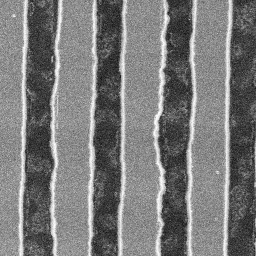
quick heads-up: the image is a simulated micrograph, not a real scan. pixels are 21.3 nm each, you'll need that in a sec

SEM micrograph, one or a few lines or trenches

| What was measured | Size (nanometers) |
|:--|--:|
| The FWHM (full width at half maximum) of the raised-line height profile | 823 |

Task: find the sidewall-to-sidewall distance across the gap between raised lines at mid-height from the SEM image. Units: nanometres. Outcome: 623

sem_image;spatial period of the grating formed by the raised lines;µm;1.45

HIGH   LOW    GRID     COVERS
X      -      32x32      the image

XXX----XXXXX----XXXXX---XXXXX---
XXX----XXXXX---XXXXXX---XXXXX---
XXX----XXXXX---XXXXXX---XXXXX---
XXX----XXXXX----XXXXX---XXXXX---
XXX----XXXXX----XXXX----XXXXX---
XXX----XXXXX----XXXXX---XXXXX---
XXX----XXXXX---XXXXXX---XXXXX---
XXX----XXXXX---XXXXXX---XXXXX---
XXX----XXXXX---XXXXX----XXXXX---
XXX----XXXXX---XXXXX----XXXXX---
XXX----XXXXX---XXXXX----XXXX----
XXX----XXXXX---XXXXX----XXXX----
XXX----XXXXX---XXXXX----XXXX----
XXX----XXXXX---XXXXX----XXXX----
XXX----XXXXX---XXXXX----XXXX----
XXX---XXXXXX---XXXXX----XXXX----
XXX---XXXXXX---XXXXX----XXXX----
XXX----XXXX----XXXXX----XXXX----
XXX----XXXX----XXXXX----XXXX----
XXX----XXXXX---XXXXX----XXXX----
XXX----XXXX----XXXXX----XXXX----
XXX----XXXXX---XXXXX----XXXX----
XXX----XXXXX---XXXXX----XXXX----
XXX----XXXX----XXXXX----XXXX----
XXX----XXXX----XXXXX---XXXXX----
XXX----XXXX----XXXXX---XXXXX----
XXX----XXXX----XXXXX----XXXX----
XXX----XXXX----XXXXX----XXXX----
XXX----XXXX----XXXXX----XXXX----
XXX----XXXX----XXXXX----XXXX----
XXX----XXXX----XXXXX----XXXX----
XXX----XXXX----XXXXX----XXXX----